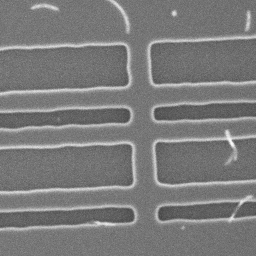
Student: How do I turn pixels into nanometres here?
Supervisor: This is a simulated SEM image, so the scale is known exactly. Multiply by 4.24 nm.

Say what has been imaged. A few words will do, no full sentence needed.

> groups of lines, slits or small figures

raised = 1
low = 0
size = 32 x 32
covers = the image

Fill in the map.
11111111111111111111111111111111
11111111111111111111111111111111
11111111111111111111111111111111
11111111111111111111111111111111
11111111111111111111111111111111
11111111111111111110000000000000
00000000000000001110000000000000
00000000000000001110000000000000
00000000000000001110000000000000
00000000000000001110000000000000
00000000000000001110000111111111
00011111111111111111111111111111
11111111111111111111111111111111
11111111111110011111000000000000
00000000000000001110000000000000
00000000000000011111111111111111
11111111111111111111111111111111
11111111111111111111111111001000
10000000000000000110000000000000
00000000000000000110000000000000
00000000000000000111000000000000
00000000000000000111000000000000
00000000000000000111000000000000
00000000000011111111111111111111
11111111111111111111111111111111
11111111111111111111111100000000
00000000000000000111000000000000
00000000000000000111001001111111
00011111111111111111111111111111
11111111111111111111111111111111
11111111111111111111111111111111
11111111111111111111111111111111